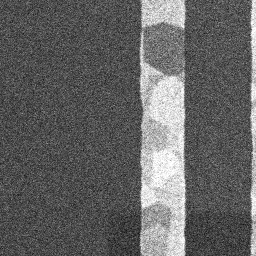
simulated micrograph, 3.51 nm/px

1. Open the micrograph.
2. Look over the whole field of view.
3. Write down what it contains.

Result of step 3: one or a few lines or trenches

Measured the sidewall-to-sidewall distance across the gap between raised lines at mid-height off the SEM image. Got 238 nm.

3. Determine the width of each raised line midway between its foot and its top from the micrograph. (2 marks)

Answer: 149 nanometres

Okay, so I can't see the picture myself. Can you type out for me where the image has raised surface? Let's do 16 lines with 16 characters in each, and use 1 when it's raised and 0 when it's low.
0000000001110000
0000000001100000
0000000001100000
0000000001100000
0000000001100000
0000000001100000
0000000001100000
0000000001100000
0000000001100000
0000000001100000
0000000001100000
0000000001110000
0000000001110000
0000000001110000
0000000001100000
0000000001110000